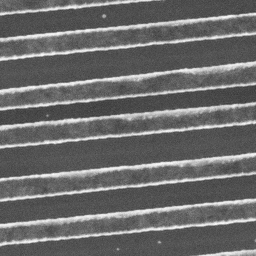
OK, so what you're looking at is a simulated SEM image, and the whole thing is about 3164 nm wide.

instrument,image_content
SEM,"lines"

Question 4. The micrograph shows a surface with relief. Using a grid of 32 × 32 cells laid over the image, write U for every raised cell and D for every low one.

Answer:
UUUUUUUUUUUUUUDDDDDDDDDDDDDDDDDD
UUUDDDDDDDDDDDDDDDDDDDDDDDDDDDDD
DDDDDDDDDDDDDDDDDDDDDDDDUUUUUUUU
DDDDDDDDDDDDDDUUUUUUUUUUUUUUUUUU
DDDDUUUUUUUUUUUUUUUUUUUUUUUUUDDD
UUUUUUUUUUUUUUUUUUUDDDDDDDDDDDDD
UUUUUUUUUDDDDDDDDDDDDDDDDDDDDDDD
DDDDDDDDDDDDDDDDDDDDDDDDDDDDDDDD
DDDDDDDDDDDDDDDDDDDDDDDDDDUUUUUU
DDDDDDDDDDDDDDDDDUUUUUUUUUUUUUUU
DDDDDDDUUUUUUUUUUUUUUUUUUUUUUUUU
UUUUUUUUUUUUUUUUUUUUUUDDDDDDDDDD
UUUUUUUUUUUUDDDDDDDDDDDDDDDDDDDD
UUDDDDDDDDDDDDDDDDDDDDDDDDUUUUUU
DDDDDDDDDDDDDDUUUUUUUUUUUUUUUUUU
DDDUUUUUUUUUUUUUUUUUUUUUUUUUUUUD
UUUUUUUUUUUUUUUUUUUUDDDDDDDDDDDD
UUUUUUUUUUDDDDDDDDDDDDDDDDDDDDDD
DDDDDDDDDDDDDDDDDDDDDDDDDDDDDDDD
DDDDDDDDDDDDDDDDDDDDDDDDDDDDDDUU
DDDDDDDDDDDDDDDDDDDUUUUUUUUUUUUU
DDDDDDDDDDUUUUUUUUUUUUUUUUUUUUUU
UUUUUUUUUUUUUUUUUUUUUUUUDDDDDDDD
UUUUUUUUUUUUUUUDDDDDDDDDDDDDDDDD
UUUUUDDDDDDDDDDDDDDDDDDDDDDDDDDD
DDDDDDDDDDDDDDDDDDDDDDDDDUUUUUUU
DDDDDDDDDDDDDDDDUUUUUUUUUUUUUUUU
DDDDDDDUUUUUUUUUUUUUUUUUUUUUUUUU
UUUUUUUUUUUUUUUUUUUUUUDDDDDDDDDD
UUUUUUUUUUUDDDDDDDDDDDDDDDDDDDDD
UDDDDDDDDDDDDDDDDDDDDDDDDDDDDDDD
DDDDDDDDDDDDDDDDDDDDDDDDDDDDDDDU